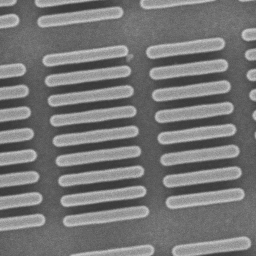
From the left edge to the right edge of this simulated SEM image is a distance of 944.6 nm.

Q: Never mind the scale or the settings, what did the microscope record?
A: groups of lines, slits or small figures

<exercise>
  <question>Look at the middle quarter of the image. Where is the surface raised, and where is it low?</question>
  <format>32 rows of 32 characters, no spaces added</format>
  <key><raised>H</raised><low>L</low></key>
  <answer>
LLLLLLLLLLLLLLLLLLLLLLLLLLHHHHHH
LLLLLLHHHHHHHHHHHLLLLLHHHHHHHHHH
HHHHHHHHHHHHHHHHLLLLLHHHHHHHHHHH
HHHHHHHHHHHHHLLLLLLLLLHHHHLLLLLL
HHHHHLLLLLLLLLLLLLLLLLLLLLLLLLLL
LLLLLLLLLLLLLLHHHLLLLLLLLLLLLLHH
LLLLLLLLLHHHHHHHHLLLLLLHHHHHHHHH
LHHHHHHHHHHHHHHHHLLLLLHHHHHHHHHH
HHHHHHHHHHHHHHLLLLLLLLHHHHHHHHLL
HHHHHLLLLLLLLLLLLLLLLLLLLLLLLLLL
LLLLLLLLLLLLLLLLLLLLLLLLLLLLLLLL
LLLLLLLLHHHHHHHHHHLLLLLLLLHHHHHH
LHHHHHHHHHHHHHHHHHLLLLLHHHHHHHHH
HHHHHHHHHHHHHLLLLLLLLLLHHHHHHHHH
HHHHHLLLLLLLLLLLLLLLLLLLLLLLLLLL
LLLLLLLLLLLLLLLLLLLLLLLLLLLLLLLL
LLLLLLLLLHHHHHHHHHLLLLLLLLLLLLHH
LHHHHHHHHHHHHHHHHHLLLLLLHHHHHHHH
HHHHHHHHHHHHHHLLLLLLLLLLHHHHHHHH
HHHHHHHHLLLLLLLLLLLLLLLLHHHHHLLL
LLLLLLLLLLLLLLLLLLLLLLLLLLLLLLLL
LLLLLLLLLHHHHHHHHHHLLLLLLLLLLLLL
LLHHHHHHHHHHHHHHHHHLLLLLLLHHHHHH
HHHHHHHHHHHHHHHHLLLLLLLLHHHHHHHH
HHHHHHHHLLLLLLLLLLLLLLLLHHHHHHHH
LLLLLLLLLLLLLLLLLLHLLLLLLLLLLLLL
LLLLLLLLLLLHHHHHHHHHLLLLLLLLLLLL
LLLHHHHHHHHHHHHHHHHHLLLLLLLLLLHH
HHHHHHHHHHHHHHHHLLLLLLLLLHHHHHHH
HHHHHHHHLLLLLLLLLLLLLLLLLHHHHHHH
LLLLLLLLLLLLLLLLLLLLLLLLLHHHLLLL
LLLLLLLLLLLLHHHHHHHHLLLLLLLLLLLL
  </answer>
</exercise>